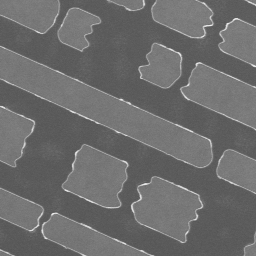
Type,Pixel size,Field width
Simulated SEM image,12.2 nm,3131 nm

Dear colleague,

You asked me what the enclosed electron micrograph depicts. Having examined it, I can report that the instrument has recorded one or a few lines or trenches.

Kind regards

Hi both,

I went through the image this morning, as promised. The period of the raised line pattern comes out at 769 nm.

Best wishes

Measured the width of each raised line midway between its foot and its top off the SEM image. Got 327 nm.